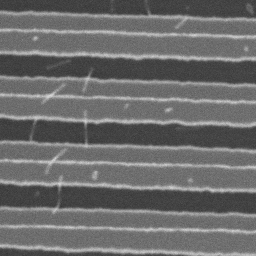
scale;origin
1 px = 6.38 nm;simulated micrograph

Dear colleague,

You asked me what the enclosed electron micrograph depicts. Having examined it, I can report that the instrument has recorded lines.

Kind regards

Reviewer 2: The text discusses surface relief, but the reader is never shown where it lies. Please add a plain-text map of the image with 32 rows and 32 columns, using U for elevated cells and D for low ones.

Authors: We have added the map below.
DDDDDDDDDDDDDDDDDDDDDDDDDDDDDDDD
DDDDDDDDDDDDDDDDDDDDDDDDDDDDDDDD
UUUUUUUUUUUUUUUUUUUUUUUUUUUUUUUU
UUUUUUUUUUUUUUUUUUUUUUUUUUUUUUUU
UUUUUUUUUUUUUUUUUUUUUUUUUUUUUUUU
UUUUUUUUUUUUUUUUUUUUUUUUUUUUUUUU
UUUUUUUUUUUUUUUUUUUUUUUUUUUUUUUU
DDDDDDDDDDDDDDDDDDDDDDDDDDDDDUDD
DDDDDDDDDDDDDDDDDDDDDDDDDDDDDDDD
DDDDDDDDDDDDDDDDDDDDDDDDDDDDDDDD
UUUUUUUUUUUUUUUUUUUUUUUUUUUUDDDD
UUUUUUUUUUUUUUUUUUUUUUUUUUUUUUUU
UUUUUUUUUUUUUUUUUUUUUUUUUUUUUUUU
UUUUUUUUUUUUUUUUUUUUUUUUUUUUUUUU
UUUUUUUUUUUUUUUUUUUUUUUUUUUUUUUU
DDDDDDDDDDDDDDDDDDDDDDDUUUUUUUUU
DDDDDDDDDDDDDDDDDDDDDDDDDDDDDDDD
DDDDDDDDDDDDDDDDDDDDDDDDDDDDDDDD
UUUUUUUUUUUUUUUUUUUUUUUUUDDDDDDD
UUUUUUUUUUUUUUUUUUUUUUUUUUUUUUUU
UUUUUUUUUUUUUUUUUUUUUUUUUUUUUUUU
UUUUUUUUUUUUUUUUUUUUUUUUUUUUUUUU
UUUUUUUUUUUUUUUUUUUUUUUUUUUUUUUU
DDDDDDDDDDDDDDDDUUUUUUUUUUUUUUUU
DDDDDDDDDDDDDDDDDDDDDDDDDDDDDDDD
DDDDDDDDDDDDDDDDDDDDDDDDDDDDDDDD
UUUUUUUUUUUUUUUUUUUUDDDDDDDDDDDD
UUUUUUUUUUUUUUUUUUUUUUUUUUUUUUUU
UUUUUUUUUUUUUUUUUUUUUUUUUUUUUUUU
UUUUUUUUUUUUUUUUUUUUUUUUUUUUUUUU
UUUUUUUUUUUUUUUUUUUUUUUUUUUUUUUU
DDDDDDDDDDDDDDDDUUUUUUUUUUUUUUUU